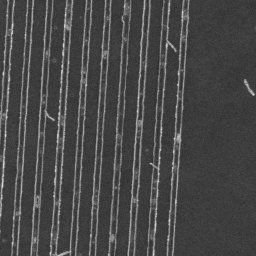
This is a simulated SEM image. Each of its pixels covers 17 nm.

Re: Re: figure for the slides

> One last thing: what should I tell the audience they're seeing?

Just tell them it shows parallel lines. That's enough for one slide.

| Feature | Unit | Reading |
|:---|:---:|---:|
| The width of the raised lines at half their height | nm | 102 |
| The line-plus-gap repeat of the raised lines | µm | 0.331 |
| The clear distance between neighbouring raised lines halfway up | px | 13.6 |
